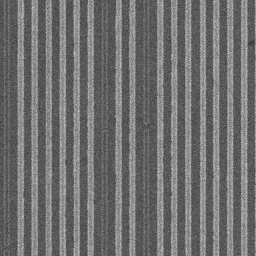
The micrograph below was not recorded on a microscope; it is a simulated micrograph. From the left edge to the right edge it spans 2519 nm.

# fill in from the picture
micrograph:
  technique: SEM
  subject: parallel lines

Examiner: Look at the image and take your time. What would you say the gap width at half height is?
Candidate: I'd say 0.0922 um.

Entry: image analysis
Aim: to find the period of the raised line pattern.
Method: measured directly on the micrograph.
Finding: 137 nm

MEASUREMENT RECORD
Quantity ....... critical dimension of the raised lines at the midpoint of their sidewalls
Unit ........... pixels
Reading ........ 4.25